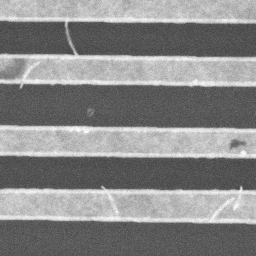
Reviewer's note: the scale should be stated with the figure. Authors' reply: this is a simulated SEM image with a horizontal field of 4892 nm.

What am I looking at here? lines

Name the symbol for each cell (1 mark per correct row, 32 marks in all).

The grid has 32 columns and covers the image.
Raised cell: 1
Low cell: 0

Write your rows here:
11111111111111111111111111111111
11111111111111111111111111111111
11111111111111111111111111111111
00000000000000000000000000000000
00000000000000000000000000000000
00000000000000000000000000000000
00000000000000000000000000000000
11111111111111111111111111111111
11111111111111111111111111111111
11111111111111111111111111111111
00100000000011111111111111111111
00000000000000000000000000000000
00000000000000000000000000000000
00000000000000000000000000000000
00000000000000000000000000000000
00000000000000000000000000000000
11111111111111111111111111111111
11111111111111111111111111111111
11111111111111111111111111111111
00000000011111111111111111111111
00000000000000000000000000000000
00000000000000000000000000000000
00000000000000000000000000000000
00000000000000000000000000000000
11111111111111111111111111111111
11111111111111111111111111111111
11111111111111111111111111111111
00000000111111111111111111111111
00000000000000000000000000000000
00000000000000000000000000000000
00000000000000000000000000000000
00000000000000000000000000000000